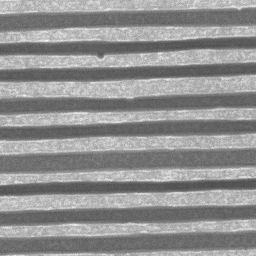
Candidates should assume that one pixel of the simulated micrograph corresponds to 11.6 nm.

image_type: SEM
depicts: parallel lines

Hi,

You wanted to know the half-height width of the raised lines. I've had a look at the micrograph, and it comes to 0.163 micrometres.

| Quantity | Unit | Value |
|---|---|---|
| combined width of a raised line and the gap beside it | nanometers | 321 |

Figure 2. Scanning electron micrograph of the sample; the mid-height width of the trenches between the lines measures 0.162 um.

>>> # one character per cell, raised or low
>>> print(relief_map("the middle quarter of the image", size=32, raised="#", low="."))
########################........
................................
................................
...........................#####
#####.##########################
################################
################################
################################
.......#######.###..............
................................
................................
.......................##.###...
################################
################################
#################...............
................................
................................
................................
..##############################
################################
################################
####################............
................................
................................
................................
................................
....................############
################################
################################
##...#.......#.....###..........
................................
................................